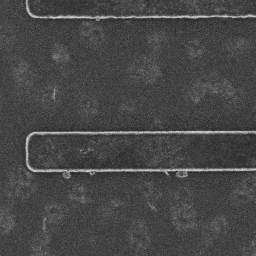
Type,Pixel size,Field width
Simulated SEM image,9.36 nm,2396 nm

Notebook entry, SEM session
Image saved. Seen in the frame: one or a few lines or trenches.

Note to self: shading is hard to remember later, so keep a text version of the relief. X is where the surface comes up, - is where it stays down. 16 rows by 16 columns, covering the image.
--XXXXXXXXXXXXXX
----------------
----------------
----------------
----------------
----------------
----------------
----------------
--XXXXXXXXXXXXXX
--XXXXXXXXXXXXXX
--XXXXXXXXXXXXXX
----------------
----------------
----------------
----------------
----------------